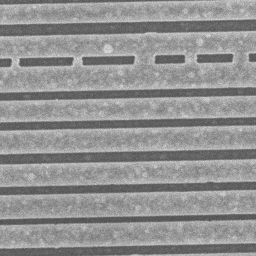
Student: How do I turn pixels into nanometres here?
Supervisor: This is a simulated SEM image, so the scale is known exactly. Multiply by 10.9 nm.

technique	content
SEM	parallel lines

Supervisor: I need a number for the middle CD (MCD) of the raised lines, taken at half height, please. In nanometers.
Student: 253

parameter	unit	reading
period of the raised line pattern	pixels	31.7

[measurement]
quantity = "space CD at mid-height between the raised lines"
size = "95.6 nm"